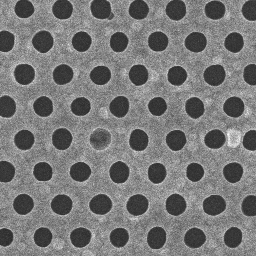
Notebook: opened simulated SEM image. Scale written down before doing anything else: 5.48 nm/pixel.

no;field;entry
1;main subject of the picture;a regular array of holes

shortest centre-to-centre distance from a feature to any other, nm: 204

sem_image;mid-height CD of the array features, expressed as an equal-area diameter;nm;112